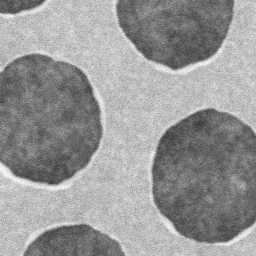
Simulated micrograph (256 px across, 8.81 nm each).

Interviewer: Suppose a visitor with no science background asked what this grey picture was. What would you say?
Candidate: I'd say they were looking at holes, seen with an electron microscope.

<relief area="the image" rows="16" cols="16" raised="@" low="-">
--@@@@@--------@
@@@@@@@-------@@
@@@@@@@@------@@
@--@@@@@@----@@@
-----@@@@@@@@@@@
------@@@@@@@@@@
------@@@@@@@@@@
------@@@@@----@
------@@@@------
------@@@@------
-----@@@@-------
@@--@@@@@-------
@@@@@@@@@@------
@@@@@@@@@@------
@@@---@@@@@----@
@@------@@@@@@@@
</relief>